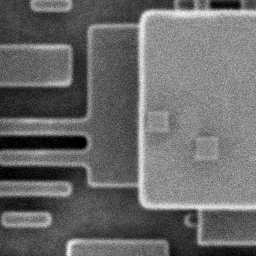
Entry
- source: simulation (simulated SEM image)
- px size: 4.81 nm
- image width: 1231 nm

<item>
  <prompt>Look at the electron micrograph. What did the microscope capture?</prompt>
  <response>wiring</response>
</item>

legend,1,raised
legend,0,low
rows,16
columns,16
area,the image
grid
0000000000000000
0000000001111111
0000000001111111
0000000001111111
0000000001111111
0000000001111111
0000000001111111
0000000001111111
0000000001111111
0000000001111111
0000000001111111
0000000001111111
0000000001111111
0000000000000000
0000000000000000
0000000000000000